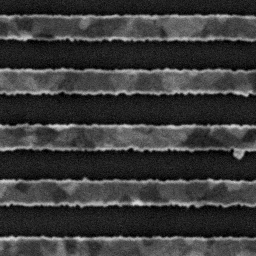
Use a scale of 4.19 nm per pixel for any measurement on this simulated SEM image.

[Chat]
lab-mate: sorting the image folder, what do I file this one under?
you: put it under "lines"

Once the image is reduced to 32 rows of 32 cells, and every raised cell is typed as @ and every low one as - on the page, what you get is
--------------------------------
--------------------------------
@@@@@@@@@@@@@@@@@@@@@@@@@@@@@@@@
@@@@@@@@@@@@@@@@@@@@@@@@@@@@@@@@
@@@@@@@@@@@@@@@@@@@@@@@@@@@@@@@@
--------------------------------
--------------------------------
--------------------------------
--------------------------------
@@@@@@@@@@@@@@@@@@@@@@@@@@@@@@@@
@@@@@@@@@@@@@@@@@@@@@@@@@@@@@@@@
@@@@@@@@@@@@@@@@@@@@@@@@@@@@@@@@
--------------------------------
--------------------------------
--------------------------------
--------------------------------
@@@@@@@@@@@@@@@@@@@@@@@@@@@@@@@@
@@@@@@@@@@@@@@@@@@@@@@@@@@@@@@@@
@@@@@@@@@@@@@@@@@@@@@@@@@@@@@@@@
--------------------------------
--------------------------------
--------------------------------
--@--@@-------@-----------@-----
@@@@@@@@@@@@@@@@@@@@@@@@@@@@@@@@
@@@@@@@@@@@@@@@@@@@@@@@@@@@@@@@@
@@@@@@@@@@@@@@@@@@@@@@@@@@@@@-@@
--------------------------------
--------------------------------
--------------------------------
--------------------------------
@@@@@@@@@@@@@@@@@@@@@@@@@@@@@@@@
@@@@@@@@@@@@@@@@@@@@@@@@@@@@@@@@